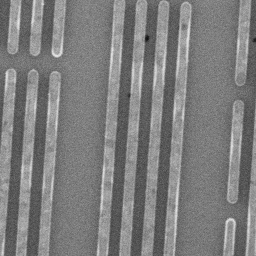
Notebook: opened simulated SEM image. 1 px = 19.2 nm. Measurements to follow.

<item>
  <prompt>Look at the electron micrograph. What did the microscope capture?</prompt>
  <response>groups of lines, slits or small figures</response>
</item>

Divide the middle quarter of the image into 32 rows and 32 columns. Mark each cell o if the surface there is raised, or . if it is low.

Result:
............oo...oo....oo...ooo.
............oo...oo....oo...ooo.
............oo...oo....oo...ooo.
............oo...oo....oo...ooo.
...........ooo...oo....oo...oo..
...........ooo...oo....oo...oo..
...........ooo...oo...ooo...oo..
...........oo....oo...ooo...oo..
...........oo....oo...ooo...oo..
...........oo....oo...oo....oo..
...........oo....oo...oo....oo..
...........oo...ooo...oo....oo..
...........oo...ooo...oo....oo..
...........oo...oo....oo....oo..
...........oo...oo....oo...ooo..
...........oo...oo....oo...ooo..
...........oo...oo....oo...oo...
...........oo...oo....oo...oo...
...........oo...oo...ooo...oo...
...........oo...oo...ooo...oo...
..........ooo...oo...ooo...oo...
..........ooo...oo...ooo...oo...
..........oo....oo...ooo...oo...
..........oo....oo...ooo...oo...
..........oo....oo...oo....oo...
..........oo....oo...oo....oo...
..........oo...ooo...oo....oo...
..........oo...ooo...oo....oo...
..........oo...ooo...oo....oo...
..........oo...oo....oo...ooo...
..........oo...oo....oo...oo....
..........oo...oo....oo...oo....